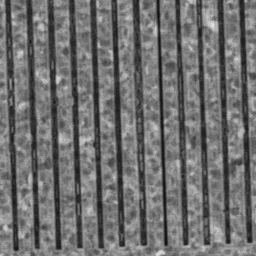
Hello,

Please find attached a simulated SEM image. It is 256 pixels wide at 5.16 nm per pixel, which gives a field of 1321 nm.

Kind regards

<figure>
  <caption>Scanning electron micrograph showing parallel lines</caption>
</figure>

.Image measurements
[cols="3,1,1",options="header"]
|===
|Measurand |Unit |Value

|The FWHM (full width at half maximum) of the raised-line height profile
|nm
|74.7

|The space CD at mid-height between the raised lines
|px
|7.62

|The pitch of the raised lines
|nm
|109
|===